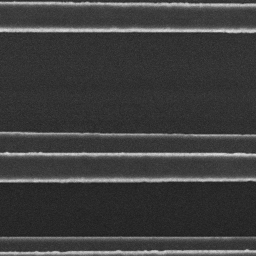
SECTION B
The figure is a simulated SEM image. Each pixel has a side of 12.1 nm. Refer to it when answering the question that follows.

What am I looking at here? lines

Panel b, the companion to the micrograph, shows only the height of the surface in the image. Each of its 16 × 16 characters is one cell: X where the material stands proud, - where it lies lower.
XXXXXXXXXXXXXXXX
XXXXXXXXXXXXXXXX
----------------
----------------
----------------
----------------
----------------
----------------
XXXXXXXXXXXXXXXX
XXXXXXXXXXXXXXXX
XXXXXXXXXXXXXXXX
----------------
----------------
----------------
----------------
XXXXXXXXXXXXXXXX